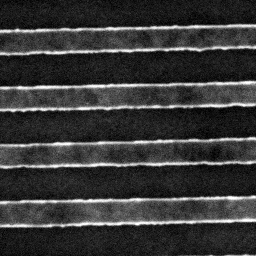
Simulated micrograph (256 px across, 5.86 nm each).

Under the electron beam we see lines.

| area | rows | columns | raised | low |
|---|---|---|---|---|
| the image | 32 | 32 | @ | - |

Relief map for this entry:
--------------------------------
--------------------------------
--------------------------------
-------------------@@@@@@@@@@@@@
@@@@@@@@@@@@@@@@@@@@@@@@@@@@@@@@
@@@@@@@@@@@@@@@@@@@@@@@@@@@@@@@@
@@@@@@@@@@@@@-------------------
--------------------------------
--------------------------------
--------------------------------
---------------------@@@@@@@@@@@
@@@@@@@@@@@@@@@@@@@@@@@@@@@@@@@@
@@@@@@@@@@@@@@@@@@@@@@@@@@@@@@@@
@@@@@@@@@@@@@@@@-@--------------
--------------------------------
--------------------------------
--------------------------------
-----------------------@@-@@@@@@
@@@@@@@@@@@@@@@@@@@@@@@@@@@@@@@@
@@@@@@@@@@@@@@@@@@@@@@@@@@@@@@@@
@@@@@@@@@@@@@@@@@@@@@@@@@-@@----
--------------------------------
--------------------------------
--------------------------------
--------------------------------
@@@@@@@@@@@@@@@@@@@@@@@@@@@@@@@@
@@@@@@@@@@@@@@@@@@@@@@@@@@@@@@@@
@@@@@@@@@@@@@@@@@@@@@@@@@@@@@@@@
--------------------------------
--------------------------------
--------------------------------
--------------------------------